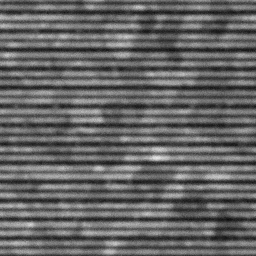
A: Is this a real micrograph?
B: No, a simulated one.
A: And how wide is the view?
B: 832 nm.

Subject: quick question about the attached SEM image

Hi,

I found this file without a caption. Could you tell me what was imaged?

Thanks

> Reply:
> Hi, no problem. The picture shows parallel lines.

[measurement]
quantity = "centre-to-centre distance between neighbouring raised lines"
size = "30.5 nm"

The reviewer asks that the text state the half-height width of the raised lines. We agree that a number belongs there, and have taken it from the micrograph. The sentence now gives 15 nanometers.